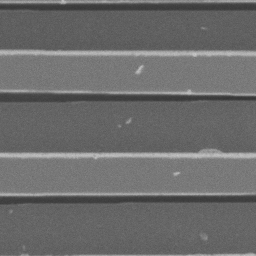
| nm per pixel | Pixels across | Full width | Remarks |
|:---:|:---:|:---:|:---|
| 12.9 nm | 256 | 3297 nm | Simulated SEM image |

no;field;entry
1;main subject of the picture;lines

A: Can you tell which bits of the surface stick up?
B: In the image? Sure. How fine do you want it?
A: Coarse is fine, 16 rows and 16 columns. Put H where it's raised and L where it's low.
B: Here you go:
LLLLLLLLLLLLLLLL
LLLLLLLLLLLLLLLL
LLLLLLLLLLLLLLLL
HHHHHHHHHHHHHHHH
HHHHHHHHHHHHHHHH
HHHHHHHHHHHHHHHH
LLLLLLLLLLLLLLLL
LLLLLLLLLLLLLLLL
LLLLLLLLLLLLLLLL
LLLLLLLLLLLLLLLL
HHHHHHHHHHHHHHHH
HHHHHHHHHHHHHHHH
LLLLLLLLLLLLLLLL
LLLLLLLLLLLLLLLL
LLLLLLLLLLLLLLLL
LLLLLLLLLLLLLLLL